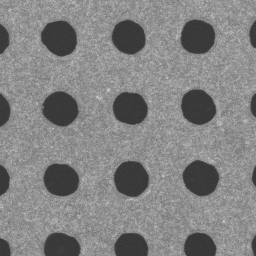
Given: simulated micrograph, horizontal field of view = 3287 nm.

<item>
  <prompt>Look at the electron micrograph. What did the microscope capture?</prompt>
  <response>a regular array of holes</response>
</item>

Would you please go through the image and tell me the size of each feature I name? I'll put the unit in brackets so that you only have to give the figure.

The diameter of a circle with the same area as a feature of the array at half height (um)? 0.451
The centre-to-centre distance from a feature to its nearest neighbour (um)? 0.889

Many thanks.